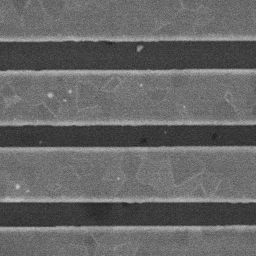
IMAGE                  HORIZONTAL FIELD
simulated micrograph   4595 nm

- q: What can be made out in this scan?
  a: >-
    lines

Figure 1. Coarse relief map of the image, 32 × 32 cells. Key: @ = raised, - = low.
@@@@@@@@@@@@@@@@@@@@@@@@@@@@@@@@
@@@@@@@@@@@@@@@@@@@@@@@@@@@@@@@@
@@@@@@@@@@@@@@@@@@@@@@@@@@@@@@@@
@@@@@@@@@@@@@@@@@@@@@@@@@@@@@@@@
@@@@@@@@@@@@@@@@@@@@@@@@@@@@@@@@
--------------------------------
--------------------------------
--------------------------------
--------------------------------
@@@@@@@@@@@@@@@@@@@@@@@@@@@@@@@@
@@@@@@@@@@@@@@@@@@@@@@@@@@@@@@@@
@@@@@@@@@@@@@@@@@@@@@@@@@@@@@@@@
@@@@@@@@@@@@@@@@@@@@@@@@@@@@@@@@
@@@@@@@@@@@@@@@@@@@@@@@@@@@@@@@@
@@@@@@@@@@@@@@@@@@@@@@@@@@@@@@@@
@@@@@@@@@@@@@@@@@@@@@@@@--@@@@@@
--------------------------------
--------------------------------
@--@-@@@@@@@@@@@@@@@@@@@@@@@@@@@
@@@@@@@@@@@@@@@@@@@@@@@@@@@@@@@@
@@@@@@@@@@@@@@@@@@@@@@@@@@@@@@@@
@@@@@@@@@@@@@@@@@@@@@@@@@@@@@@@@
@@@@@@@@@@@@@@@@@@@@@@@@@@@@@@@@
@@@@@@@@@@@@@@@@@@@@@@@@@@@@@@@@
@@@@@@@@@@@@@@@@@@@@@@@@@@@@@@@@
--------------------------------
--------------------------------
--------------------------------
@@@@@@@@@@@@@@@@@@@@@@@@@@@@@@@@
@@@@@@@@@@@@@@@@@@@@@@@@@@@@@@@@
@@@@@@@@@@@@@@@@@@@@@@@@@@@@@@@@
@@@@@@@@@@@@@@@@@@@@@@@@@@@@@@@@